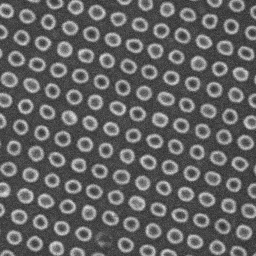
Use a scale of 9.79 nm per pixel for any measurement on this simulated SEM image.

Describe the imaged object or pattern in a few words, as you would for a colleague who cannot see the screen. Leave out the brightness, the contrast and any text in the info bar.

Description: a regular array of raised bodies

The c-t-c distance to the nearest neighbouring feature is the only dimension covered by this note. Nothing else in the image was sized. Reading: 210 nanometres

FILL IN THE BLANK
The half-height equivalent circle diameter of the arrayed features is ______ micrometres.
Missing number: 0.137